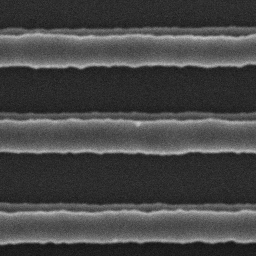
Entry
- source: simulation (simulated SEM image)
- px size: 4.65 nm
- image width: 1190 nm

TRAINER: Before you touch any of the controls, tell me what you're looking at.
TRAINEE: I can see lines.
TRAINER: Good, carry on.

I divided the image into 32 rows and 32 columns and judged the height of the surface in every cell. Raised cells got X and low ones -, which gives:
--------------------------------
--------------------------------
--------------------------------
--------------------------------
XXXXXXXXXX-X-XXXXXXXXXXXX--X---X
XXXXXXXXXXXXXXXXXXXXXXXXXXXXXXXX
XXXXXXXXXXXXXXXXXXXXXXXXXXXXXXXX
XXXXXXXXXXXXXXXXXXXXXXXXXXXXXXXX
----X---------------------------
--------------------------------
--------------------------------
--------------------------------
--------------------------------
--------------------------------
--------------------------------
XXXXXXXXXXXXXXXXXXXXXXXXXXXXXXXX
XXXXXXXXXXXXXXXXXXXXXXXXXXXXXXXX
XXXXXXXXXXXXXXXXXXXXXXXXXXXXXXXX
XXXXXXXXXXXXXXXXXXXXXXXXXXXXXXXX
--------------------------------
--------------------------------
--------------------------------
--------------------------------
--------------------------------
--------------------------------
--------------------------------
----XXXXX----XXXXX-XXXXXXXXX--XX
XXXXXXXXXXXXXXXXXXXXXXXXXXXXXXXX
XXXXXXXXXXXXXXXXXXXXXXXXXXXXXXXX
XXXXXXXXXXXXXXXXXXXXXXXXXXXXXXXX
--------------------------------
--------------------------------